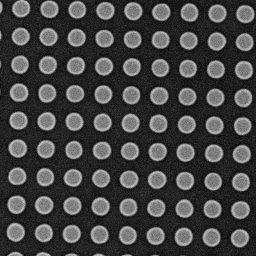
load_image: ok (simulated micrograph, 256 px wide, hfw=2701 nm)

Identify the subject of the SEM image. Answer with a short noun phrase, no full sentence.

an array of small figures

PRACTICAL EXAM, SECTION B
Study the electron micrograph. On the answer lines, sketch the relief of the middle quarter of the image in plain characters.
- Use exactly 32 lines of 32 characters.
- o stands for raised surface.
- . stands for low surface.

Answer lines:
.oooo...oooo...oooo...oooo...ooo
.oooo...oooo...oooo...oooo...ooo
.........oo.....oo.....ooo...ooo
................................
................................
..oo.....oo.....................
.oooo...oooo...oooo...oooo...ooo
.oooo...oooo...oooo...oooo...ooo
.oooo...oooo...oooo...oooo...ooo
..o......oo.....oo....ooo....ooo
................................
................................
.ooo............................
.ooo....ooo....oooo...ooo....ooo
.oooo...oooo...oooo..ooooo...ooo
.oooo...oooo...oooo..ooooo...ooo
..o......oo....ooo....ooo....ooo
................................
................................
..o.............................
.ooo....ooo....ooo....ooo....ooo
oooo...ooooo..ooooo..ooooo..oooo
.ooo...oooo...ooooo..oooo...oooo
..o.....oo.....ooo....ooo....ooo
................................
................................
.oo.............................
oooo...oooo....ooo....ooo....ooo
oooo...oooo...ooooo..ooooo..oooo
oooo...oooo...oooo...oooo...oooo
..o.....ooo....ooo....ooo....ooo
................................